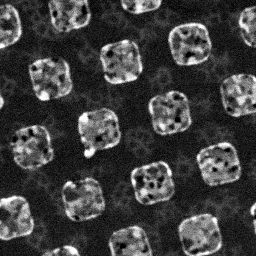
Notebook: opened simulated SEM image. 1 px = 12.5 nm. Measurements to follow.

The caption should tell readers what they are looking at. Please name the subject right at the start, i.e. a regular array of raised bodies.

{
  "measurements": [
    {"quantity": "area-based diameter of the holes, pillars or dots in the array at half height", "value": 519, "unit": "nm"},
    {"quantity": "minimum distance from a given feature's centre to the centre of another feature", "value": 70.5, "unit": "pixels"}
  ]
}